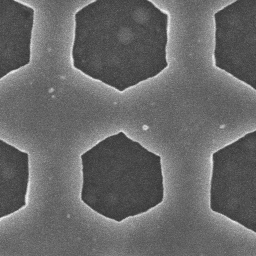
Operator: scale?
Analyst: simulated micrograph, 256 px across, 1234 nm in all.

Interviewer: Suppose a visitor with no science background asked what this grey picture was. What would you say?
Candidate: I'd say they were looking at holes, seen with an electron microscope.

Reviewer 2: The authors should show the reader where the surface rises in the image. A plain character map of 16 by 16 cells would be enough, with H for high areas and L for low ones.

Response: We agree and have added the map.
LLHHHLLLLLHHHHLL
LLHHHLLLLLHHHLLL
LLHHHLLLLLHHHLLL
LLHHHLLLLLHHHLLL
LHHHHLLLLLHHHHLL
HHHHHHHLHHHHHHHH
HHHHHHHHHHHHHHHH
HHHHHHHHHHHHHHHH
HHHHHHHLHHHHHHHL
LHHHHLLLLHHHHHLL
LLHHHLLLLLHHHLLL
LLHHHLLLLLHHHLLL
LLHHHLLLLLHHHLLL
HHHHHHLLHHHHHHLL
HHHHHHHHHHHHHHHH
HHHHHHHHHHHHHHHH